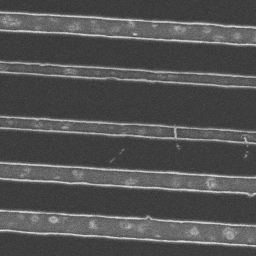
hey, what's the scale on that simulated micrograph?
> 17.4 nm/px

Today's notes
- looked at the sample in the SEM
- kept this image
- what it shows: parallel lines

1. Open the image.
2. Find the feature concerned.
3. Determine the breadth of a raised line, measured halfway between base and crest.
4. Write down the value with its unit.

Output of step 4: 0.589 um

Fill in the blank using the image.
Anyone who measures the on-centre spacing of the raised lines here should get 862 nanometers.